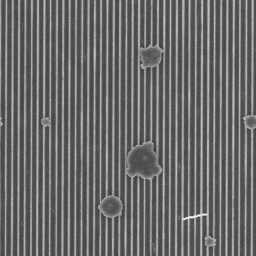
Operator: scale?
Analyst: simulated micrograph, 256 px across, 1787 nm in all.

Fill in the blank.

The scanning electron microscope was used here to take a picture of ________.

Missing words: parallel lines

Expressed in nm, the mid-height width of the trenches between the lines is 33.2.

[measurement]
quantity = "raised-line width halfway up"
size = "6.1 nanometers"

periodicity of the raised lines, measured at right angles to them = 44 nanometres